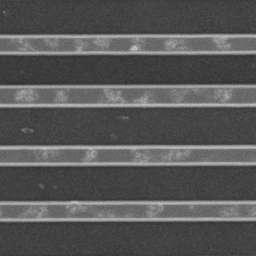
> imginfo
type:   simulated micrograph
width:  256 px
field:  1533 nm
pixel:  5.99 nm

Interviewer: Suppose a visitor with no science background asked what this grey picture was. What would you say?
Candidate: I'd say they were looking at parallel lines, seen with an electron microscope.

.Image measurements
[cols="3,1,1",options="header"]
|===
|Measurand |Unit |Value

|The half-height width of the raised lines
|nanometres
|107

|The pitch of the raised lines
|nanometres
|332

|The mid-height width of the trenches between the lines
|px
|37.7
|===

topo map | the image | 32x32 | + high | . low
................................
................................
................................
................................
..................++..++++++++++
++++++++++++++++++++++++++++++++
++++++++++++++++++++++++++++++++
................................
................................
................................
................................
++++++++++++++++++++++++++++++++
++++++++++++++++++++++++++++++++
................................
................................
................................
................................
................................
++++++++++++++++++++++++++++++++
++++++++++++++++++++++++++++++++
++++++++++++++++++++++..........
................................
................................
................................
................................
++++++++++++++++++++++++++++++++
++++++++++++++++++++++++++++++++
+++++...............+...........
................................
................................
................................
................................